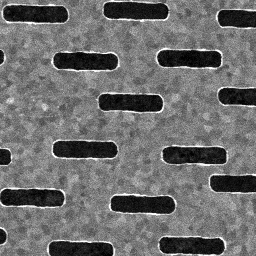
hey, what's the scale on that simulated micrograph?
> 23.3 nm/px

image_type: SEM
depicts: a regular array of holes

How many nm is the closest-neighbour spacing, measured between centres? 1520